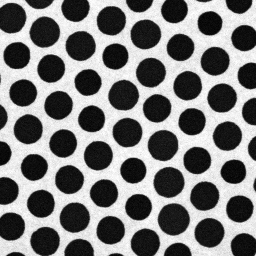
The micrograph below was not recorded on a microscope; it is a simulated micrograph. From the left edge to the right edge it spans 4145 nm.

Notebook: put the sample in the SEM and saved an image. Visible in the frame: a regular array of holes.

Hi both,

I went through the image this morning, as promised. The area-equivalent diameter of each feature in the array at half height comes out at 463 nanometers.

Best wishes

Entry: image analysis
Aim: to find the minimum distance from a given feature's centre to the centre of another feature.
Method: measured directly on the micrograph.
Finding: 591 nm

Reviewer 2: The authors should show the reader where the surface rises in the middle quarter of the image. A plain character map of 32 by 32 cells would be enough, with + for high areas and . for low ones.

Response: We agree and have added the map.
++++++++++.....+++.......+++++++
+++++..+++++++++++.......+++++++
+++......+++++++++.......++++...
+++......+++++++++.......+++....
+++......++++....++......++.....
+++......+++......++...++++.....
+++......++........++++++++.....
.+++....+++........+++++++++....
..+++++++++........++.....+++...
..+++++++++.......++.......+++++
..++++..++++......++.......+++++
..+++....+++++..++++.......+++..
.+++......++++++++++.......++...
++++......+++++..++++.....+++...
++++......+++......+++..++++....
++++......++.......++++++++++...
.++++....+++........++++..+++...
..++++++++++........++......++..
...+++++++++.......++.......++++
...++++...+++......++.......++++
...+++.....+++...++++........+++
...++.......+++++++++.......+++.
..+++.......++++++++++......++..
+++++.......++++..++++.....+++..
+++++.......+++.....++++++++++..
..++++.....+++......++++++++++..
....+++..+++++.......+++.....++.
.....+++++++++......+++.......++
.....++++++++++.....++........++
.....+++....++++...+++........++
.....++......+++++++++........++
....+++......++++++++++.......++